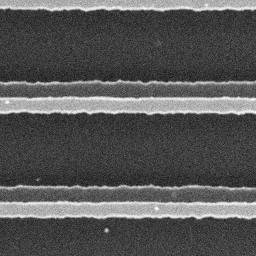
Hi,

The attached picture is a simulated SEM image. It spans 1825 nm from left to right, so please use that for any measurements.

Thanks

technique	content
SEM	lines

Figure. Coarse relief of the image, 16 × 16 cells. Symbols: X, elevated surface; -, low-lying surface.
XXXXXXXXXXXXXXXX
----------------
----------------
----------------
----------------
XXXXXXXXXXXXXXXX
XXXXXXXXXXXXXXXX
----------------
----------------
----------------
----------------
----------------
XXXXXXXXXXXXXXXX
XXXXXXXXXXXXXXXX
----------------
----------------